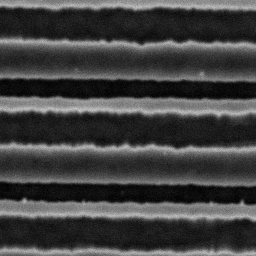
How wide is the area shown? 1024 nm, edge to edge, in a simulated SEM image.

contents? lines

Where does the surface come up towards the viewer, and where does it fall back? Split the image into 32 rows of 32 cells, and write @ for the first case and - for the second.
@@@@@@@@@@@@@@@@@@@@@@@@@@@@@@@@
--------------------------------
--------------------------------
--------------------------------
--------------------------------
@@@@@@@@@@@@@@@@@-@@@@@@@@@@@@@-
@@@@@@@@@@@@@@@@@@@@@@@@@@@@@@@@
@@@@@@@@@@@@@@@@@@@@@@@@@@@@@@@@
@@@@@@@@@@@@@@@@@@@@@@@@@@@@@@@@
@@@@@@@@@@@@@@@@@@@@@@@@@@@@@@@@
--------------------------------
--------------------------------
@@@@@@@@@@@@@@@@@@@@@@@@@@@@@@@@
@@@@@@@@@@@@@@@@@@@@@@@@@@@@@@@@
--------------------------------
--------------------------------
--------------------------------
--------------------------------
@@@@@@@@@@@@@@@@@@@@@--@@------@
@@@@@@@@@@@@@@@@@@@@@@@@@@@@@@@@
@@@@@@@@@@@@@@@@@@@@@@@@@@@@@@@@
@@@@@@@@@@@@@@@@@@@@@@@@@@@@@@@@
@@@@@@@@@@@@@@@@@@@@@@@@@@@@@@@@
--------------------------------
--------------------------------
@@@@@@@@@@@@@@@@@@@@@@@-@@@@@@@-
@@@@@@@@@@@@@@@@@@@@@@@@@@@@@@@@
--------------------------------
--------------------------------
--------------------------------
--------------------------------
@@@@@@@@@@@@@@@-@@-@@@--@@@@@--@